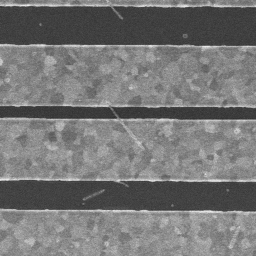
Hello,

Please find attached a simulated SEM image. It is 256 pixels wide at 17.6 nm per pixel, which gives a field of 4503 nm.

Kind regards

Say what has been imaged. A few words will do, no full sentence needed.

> lines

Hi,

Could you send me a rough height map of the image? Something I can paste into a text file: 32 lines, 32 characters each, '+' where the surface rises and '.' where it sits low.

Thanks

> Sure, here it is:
++++++++++++++++++++++++++++++++
................................
................................
................................
................................
................................
++++++++++++++++++++++++++++++++
++++++++++++++++++++++++++++++++
++++++++++++++++++++++++++++++++
++++++++++++++++++++++++++++++++
++++++++++++++++++++++++++++++++
++++++++++++++++++++++++++++++++
++++++++++++++++++++++++++++++++
................................
................................
++++++++++++++++++++++++++++++++
++++++++++++++++++++++++++++++++
++++++++++++++++++++++++++++++++
++++++++++++++++++++++++++++++++
++++++++++++++++++++++++++++++++
++++++++++++++++++++++++++++++++
++++++++++++++++++++++++++++++++
......++++++++++++++++++++++++++
................................
................................
................................
++++++++++++++++++++++++++++....
++++++++++++++++++++++++++++++++
++++++++++++++++++++++++++++++++
++++++++++++++++++++++++++++++++
++++++++++++++++++++++++++++++++
++++++++++++++++++++++++++++++++